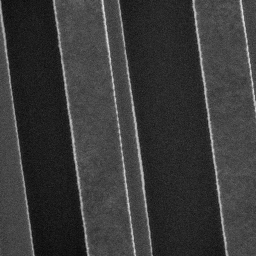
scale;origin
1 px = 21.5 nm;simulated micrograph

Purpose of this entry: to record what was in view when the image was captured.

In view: lines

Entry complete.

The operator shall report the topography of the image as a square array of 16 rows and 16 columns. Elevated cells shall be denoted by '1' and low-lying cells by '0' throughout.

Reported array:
0001111000001111
0000111100001111
0000111100001111
0000111100000111
1000111100000111
1000111100000111
1000111100000111
1000111100000111
1000011110000111
1000011110000111
1000011110000111
1100011110000011
1100011110000011
1100011110000011
1100011110000011
1100011110000011